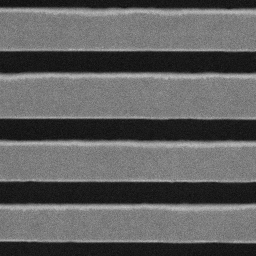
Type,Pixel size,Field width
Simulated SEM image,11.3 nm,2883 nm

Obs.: lines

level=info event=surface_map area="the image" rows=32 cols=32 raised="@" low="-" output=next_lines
--------------------------------
@@@@@@@@@@@@@@@@@@@@@@@@@@@@@@@@
@@@@@@@@@@@@@@@@@@@@@@@@@@@@@@@@
@@@@@@@@@@@@@@@@@@@@@@@@@@@@@@@@
@@@@@@@@@@@@@@@@@@@@@@@@@@@@@@@@
@@@@@@@@@@@@@@@@@@@@@@@@@@@@@@@@
--------------------------------
--------------------------------
--------------------------------
@@@@@@@@@@@@@@@@@@@@@@@@@@@@@@@@
@@@@@@@@@@@@@@@@@@@@@@@@@@@@@@@@
@@@@@@@@@@@@@@@@@@@@@@@@@@@@@@@@
@@@@@@@@@@@@@@@@@@@@@@@@@@@@@@@@
@@@@@@@@@@@@@@@@@@@@@@@@@@@@@@@@
@@@@@@@@@@@@@@@@@@@@@@@@@@@@@@@@
--------------------------------
--------------------------------
--------------------------------
@@@@@@@@@@@@@@@@@@@@@@@@@@@@@@@@
@@@@@@@@@@@@@@@@@@@@@@@@@@@@@@@@
@@@@@@@@@@@@@@@@@@@@@@@@@@@@@@@@
@@@@@@@@@@@@@@@@@@@@@@@@@@@@@@@@
@@@@@@@@@@@@@@@@@@@@@@@@@@@@@@@@
--------------------------------
--------------------------------
--------------------------------
@@@@@@@@@@@@@@@@@@@@@@@@@@@@@@@@
@@@@@@@@@@@@@@@@@@@@@@@@@@@@@@@@
@@@@@@@@@@@@@@@@@@@@@@@@@@@@@@@@
@@@@@@@@@@@@@@@@@@@@@@@@@@@@@@@@
--------------------------------
--------------------------------